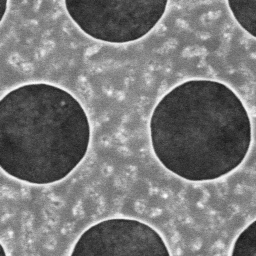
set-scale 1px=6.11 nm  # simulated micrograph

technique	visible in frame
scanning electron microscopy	holes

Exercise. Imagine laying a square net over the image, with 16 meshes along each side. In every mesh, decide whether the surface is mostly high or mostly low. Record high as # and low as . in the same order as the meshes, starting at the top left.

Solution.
####......####..
#####.....#####.
######..########
################
################
#...#######...##
.....#####.....#
.....####.......
......###.......
.....#####.....#
.....#####.....#
################
################
################
#####.....#####.
#####.....#####.